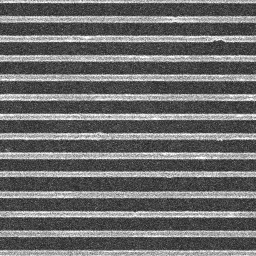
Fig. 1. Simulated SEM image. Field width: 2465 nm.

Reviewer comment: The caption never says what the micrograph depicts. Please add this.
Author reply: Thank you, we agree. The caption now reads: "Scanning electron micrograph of parallel lines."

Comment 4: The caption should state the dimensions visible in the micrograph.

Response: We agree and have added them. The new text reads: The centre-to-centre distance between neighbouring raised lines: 0.187 micrometres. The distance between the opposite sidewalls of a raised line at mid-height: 57.8 nanometers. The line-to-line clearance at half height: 135 nanometres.